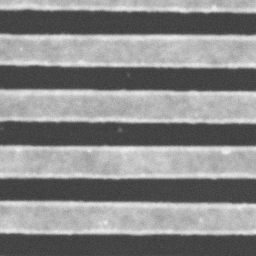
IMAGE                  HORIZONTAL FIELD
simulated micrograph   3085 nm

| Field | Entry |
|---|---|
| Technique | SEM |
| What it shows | lines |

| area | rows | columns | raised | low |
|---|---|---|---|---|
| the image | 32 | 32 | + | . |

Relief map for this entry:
++++++++++++++++++++++++++++++++
...............................+
................................
................................
++++++++++++++++++++++++....++..
++++++++++++++++++++++++++++++++
++++++++++++++++++++++++++++++++
++++++++++++++++++++++++++++++++
................................
................................
................................
++++++++++++++++++++++..........
++++++++++++++++++++++++++++++++
++++++++++++++++++++++++++++++++
++++++++++++++++++++++++++++++++
................................
................................
................................
++++++++++++++++++++++++++++++++
++++++++++++++++++++++++++++++++
++++++++++++++++++++++++++++++++
++++++++++++++++++++++++++++++++
................................
................................
................................
++++++++++++++++++++++++++++....
++++++++++++++++++++++++++++++++
++++++++++++++++++++++++++++++++
++++++++++++++++++++++++++++++++
................................
................................
................................